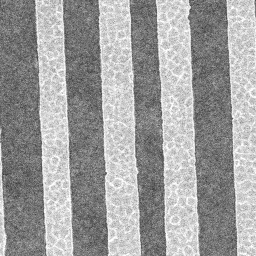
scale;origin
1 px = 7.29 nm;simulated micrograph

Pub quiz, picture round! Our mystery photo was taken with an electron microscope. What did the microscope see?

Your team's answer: one or a few lines or trenches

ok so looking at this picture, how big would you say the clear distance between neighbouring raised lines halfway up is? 0.269 micrometres